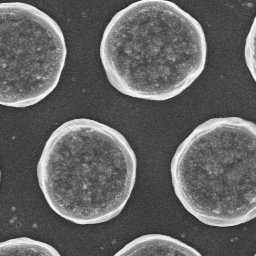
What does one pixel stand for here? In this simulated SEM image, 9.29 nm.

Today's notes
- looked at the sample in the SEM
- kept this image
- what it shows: raised bodies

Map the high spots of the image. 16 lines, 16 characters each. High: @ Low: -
@@------@@@-----
@@@----@@@@@----
@@@@---@@@@@@---
@@@@--@@@@@@@---
@@@@---@@@@@----
@@@-----@@@-----
@---------------
----------------
---@@@@-----@@@@
---@@@@@---@@@@@
---@@@@@---@@@@@
---@@@@@---@@@@@
---@@@@@---@@@@@
----@@@-----@@@@
----------------
@@@-----@@@@----